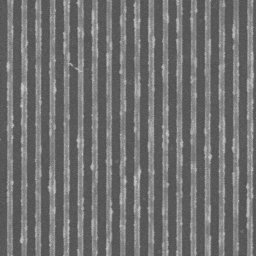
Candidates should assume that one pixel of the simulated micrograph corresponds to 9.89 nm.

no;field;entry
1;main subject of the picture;parallel lines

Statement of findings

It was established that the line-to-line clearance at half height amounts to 89 nm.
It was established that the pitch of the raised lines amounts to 0.14 micrometres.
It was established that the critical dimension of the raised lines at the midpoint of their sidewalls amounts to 50.7 nanometres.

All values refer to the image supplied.